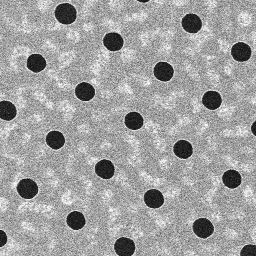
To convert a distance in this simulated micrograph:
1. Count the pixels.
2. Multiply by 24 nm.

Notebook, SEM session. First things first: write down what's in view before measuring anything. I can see a regular array of holes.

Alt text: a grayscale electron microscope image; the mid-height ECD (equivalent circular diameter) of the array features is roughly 482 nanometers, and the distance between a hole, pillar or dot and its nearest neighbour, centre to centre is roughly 1360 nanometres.